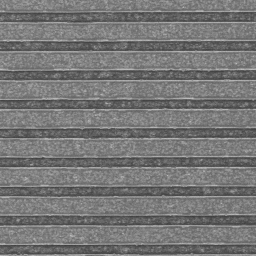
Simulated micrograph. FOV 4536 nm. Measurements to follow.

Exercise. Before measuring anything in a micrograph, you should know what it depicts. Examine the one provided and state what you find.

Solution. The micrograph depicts parallel lines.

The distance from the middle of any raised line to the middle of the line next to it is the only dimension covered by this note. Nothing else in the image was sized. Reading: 0.515 um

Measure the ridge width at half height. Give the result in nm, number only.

321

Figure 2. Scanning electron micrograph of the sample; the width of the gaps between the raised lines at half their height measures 10.9 pixels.